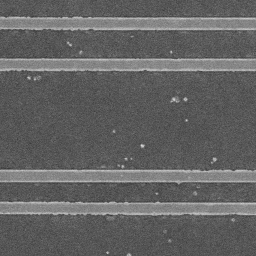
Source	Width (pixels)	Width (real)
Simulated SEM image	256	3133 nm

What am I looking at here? lines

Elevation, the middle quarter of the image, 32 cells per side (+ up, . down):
++++++++++++++++++++++++++++++++
++++++++++++++++++++++++++++++++
................................
................................
................................
................................
................................
................................
................................
................................
................................
................................
................................
................................
................................
................................
................................
................................
................................
................................
................................
................................
................................
................................
................................
................................
................................
++++++++++++++++++++++++++++++++
++++++++++++++++++++++++++++++++
............................++..
................................
................................